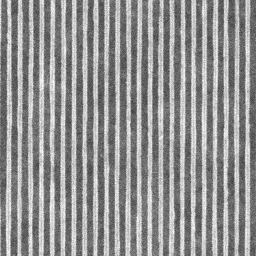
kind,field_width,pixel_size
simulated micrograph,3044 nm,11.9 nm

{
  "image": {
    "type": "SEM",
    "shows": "parallel lines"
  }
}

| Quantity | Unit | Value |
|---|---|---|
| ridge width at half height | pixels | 2.62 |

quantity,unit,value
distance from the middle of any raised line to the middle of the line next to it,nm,129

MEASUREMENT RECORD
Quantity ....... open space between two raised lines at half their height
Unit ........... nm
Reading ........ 92.2